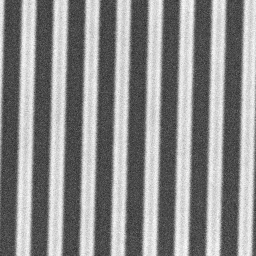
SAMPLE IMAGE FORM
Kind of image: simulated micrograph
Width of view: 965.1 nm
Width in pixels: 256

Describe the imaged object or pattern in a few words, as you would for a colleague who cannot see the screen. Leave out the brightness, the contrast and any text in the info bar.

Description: parallel lines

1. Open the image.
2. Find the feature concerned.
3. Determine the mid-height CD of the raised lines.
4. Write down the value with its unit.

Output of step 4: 43.3 nm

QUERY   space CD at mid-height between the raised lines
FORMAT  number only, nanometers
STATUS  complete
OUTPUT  76.2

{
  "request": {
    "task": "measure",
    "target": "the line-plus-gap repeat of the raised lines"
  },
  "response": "119 nm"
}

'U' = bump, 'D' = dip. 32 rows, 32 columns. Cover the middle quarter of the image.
DDDDDUUUDDDDDUUUDDDDDUUUDDDDDUUU
DDDDDUUUDDDDDUUUDDDDDUUUDDDDDUUU
DDDDDUUUDDDDDUUUDDDDDUUUDDDDDUUU
DDDDDUUUDDDDDUUUDDDDDUUUDDDDDUUU
DDDDDUUUDDDDDUUUDDDDDUUUDDDDDUUU
DDDDDUUUDDDDDUUUDDDDDUUUDDDDDUUU
DDDDDUUUDDDDDUUUDDDDDUUUDDDDDUUU
DDDDDUUUDDDDDUUUDDDDDUUUDDDDDUUU
DDDDDUUUDDDDDUUUDDDDDUUUDDDDDUUU
DDDDDUUUDDDDDUUUDDDDDUUUDDDDDUUU
DDDDDUUUDDDDDUUUDDDDDUUUDDDDDUUD
DDDDDUUUDDDDDUUUDDDDDUUUDDDDDUUD
DDDDDUUUDDDDDUUUDDDDDUUUDDDDDUUU
DDDDDUUUDDDDDUUUDDDDDUUUDDDDDUUU
DDDDDUUUDDDDDUUUDDDDDUUUDDDDDUUU
DDDDDUUUDDDDDUUUDDDDDUUUDDDDDUUU
DDDDDUUUDDDDDUUUDDDDDUUUDDDDDUUU
DDDDDUUUDDDDDUUUDDDDDUUUDDDDDUUU
DDDDDUUUDDDDDUUUDDDDDUUUDDDDDUUU
DDDDDUUUDDDDDUUUDDDDDUUUDDDDDUUD
DDDDDUUUDDDDDUUUDDDDDUUUDDDDDUUD
DDDDDUUUDDDDDUUUDDDDDUUDDDDDDUUD
DDDDDUUUDDDDDUUUDDDDDUUDDDDDDUUD
DDDDDUUUDDDDDUUUDDDDDUUDDDDDDUUD
DDDDDUUUDDDDDUUDDDDDDUUDDDDDDUUD
DDDDDUUUDDDDDUUDDDDDDUUDDDDDUUUD
DDDDDUUDDDDDDUUDDDDDDUUDDDDDUUUD
DDDDDUUDDDDDDUUDDDDDUUUDDDDDUUUD
DDDDDUUDDDDDDUUDDDDDUUUDDDDDUUUD
DDDDDUUDDDDDDUUDDDDDUUUDDDDDUUUD
DDDDDUUDDDDDUUUDDDDDUUUDDDDDUUUD
DDDDDUUDDDDDUUUDDDDDUUUDDDDDUUUD